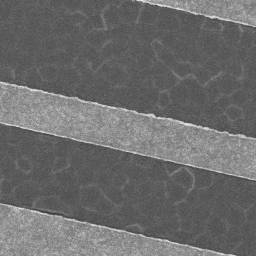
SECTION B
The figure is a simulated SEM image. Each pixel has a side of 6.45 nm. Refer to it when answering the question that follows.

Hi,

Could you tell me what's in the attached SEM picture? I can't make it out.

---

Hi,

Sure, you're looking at one or a few lines or trenches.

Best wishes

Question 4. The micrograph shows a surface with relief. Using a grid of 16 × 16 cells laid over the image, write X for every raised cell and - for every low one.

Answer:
-----------XXXXX
---------------X
----------------
----------------
----------------
XX--------------
XXXXXX----------
XXXXXXXXXXX-----
----XXXXXXXXXXX-
--------XXXXXXXX
-------------XXX
----------------
----------------
XXXX------------
XXXXXXXX--------
XXXXXXXXXXXX----